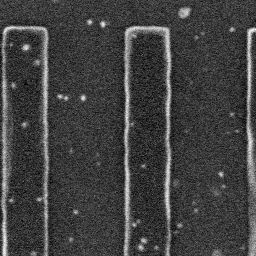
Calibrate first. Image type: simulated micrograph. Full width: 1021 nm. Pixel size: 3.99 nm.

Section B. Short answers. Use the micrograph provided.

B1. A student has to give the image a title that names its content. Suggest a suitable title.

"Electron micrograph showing wiring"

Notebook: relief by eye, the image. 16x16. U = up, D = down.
DDDDDDDDDDDDDDDD
DDDDDDDDDDDDDDDD
UUUDDDDDUUDDDDDD
UUUDDDDDUUUDDDDD
UUUDDDDDUUUDDDDD
UUUDDDDDUUUDDDDD
UUUDDDDDUUUDDDDD
UUUDDDDDUUDDDDDD
UUUDDDDDUUDDDDDD
UUUDDDDDUUUDDDDD
UUUDDDDDUUDDDDDD
UUUDDDDDUUDDDDDD
UUUDDDDDUUDDDDDD
UUUDDDDDUUUDDDDD
UUUDDDDDUUUDDDDD
UUUDDDDDUUUDDDDD